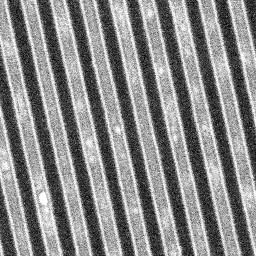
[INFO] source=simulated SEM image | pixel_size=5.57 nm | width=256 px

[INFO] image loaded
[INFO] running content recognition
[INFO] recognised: parallel lines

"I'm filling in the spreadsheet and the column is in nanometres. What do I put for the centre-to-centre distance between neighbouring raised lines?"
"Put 161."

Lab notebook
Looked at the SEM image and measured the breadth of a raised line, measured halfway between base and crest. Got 92.5 nm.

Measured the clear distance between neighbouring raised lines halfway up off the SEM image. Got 66.7 nm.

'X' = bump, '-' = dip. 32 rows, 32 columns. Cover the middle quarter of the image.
X---XXXX---XXXX---XXXXX---XXXX--
X---XXXX---XXXXX---XXXX---XXXX--
X---XXXX----XXXX---XXXX---XXXXX-
X----XXXX---XXXX---XXXX----XXXX-
X----XXXX---XXXX---XXXXX---XXXX-
XX---XXXX---XXXX----XXXX---XXXX-
XX---XXXX----XXXX---XXXX---XXXXX
XX---XXXX----XXXX---XXXX---XXXXX
XX----XXXX---XXXX---XXXX----XXXX
XX----XXXX---XXXX---XXXXX---XXXX
XXX---XXXX---XXXXX---XXXX---XXXX
XXX---XXXXX---XXXX---XXXX---XXXX
XXX----XXXX---XXXX---XXXX----XXX
XXX----XXXX---XXXX---XXXX----XXX
XXXX---XXXX---XXXX----XXXX---XXX
XXXX---XXXX----XXX----XXXX---XXX
XXXX---XXXX----XXXX---XXXX---XXX
XXXX----XXXX---XXXX---XXXX----XX
XXXX----XXXX---XXXX---XXXXX---XX
-XXXX---XXXX---XXXX----XXXX---XX
-XXXX---XXXX---XXXXX---XXXX---XX
-XXXX---XXXXX---XXXX---XXXX---XX
-XXXX----XXXX---XXXX---XXXXX---X
-XXXXX---XXXX---XXXX----XXXX---X
--XXXX---XXXX----XXX----XXXX---X
--XXXX---XXXX----XXXX---XXXX---X
--XXXX----XXXX---XXXX---XXXXX---
--XXXX----XXXX---XXXX---XXXXX---
---XXXX---XXXX---XXXX----XXXX---
---XXXX---XXXX----XXXX---XXXX---
---XXXX---XXXX----XXXX---XXXX---
---XXXX----XXXX---XXXX---XXXXX--